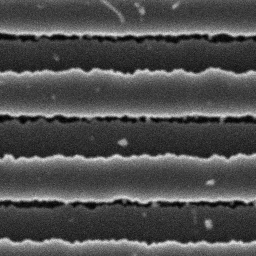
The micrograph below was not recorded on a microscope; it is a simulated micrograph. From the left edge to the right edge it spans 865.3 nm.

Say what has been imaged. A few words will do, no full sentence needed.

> lines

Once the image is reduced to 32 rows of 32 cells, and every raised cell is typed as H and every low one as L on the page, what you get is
HHHHHHHHHHHHHHHHHHHHHHHHHHHHHHHH
HHHHHHHHHHHHHHHHHHHHHHHHHHHHHHHH
HHHHHHHHHHHHHHHHHHHHHHHHHHHHHHHH
HHHHHHHHHHHHHHHHHHHHHHHHHHHHHHHH
LLLLLLLLLLLLLLLHLHLLLLLLLLLLLHLL
LLLLLLLLLLLLLLLLLLLLLLLLLLLLLLLL
LLLLLLLLLLLLLLLLLLLLLLLLLLLLLLLL
LLLLLLLLLLLLLLLLLLLLLLLLLLLLLLLL
LLLLLLLLLLLLLLLLLLLLLLLLLLLLLLLL
HHHHHHHHHHHHHHHHHHHHHHHHHHHHHHHH
HHHHHHHHHHHHHHHHHHHHHHHHHHHHHHHH
HHHHHHHHHHHHHHHHHHHHHHHHHHHHHHHH
HHHHHHHHHHHHHHHHHHHHHHHHHHHHHHHH
HHHHHHHHHHHHHHHHHHHHHHHHHHHHHHHH
LHLHLHHLHHHHHHHLHHHHHHHLLHHHHHLL
LLLLLLLLLLLLLLLLLLLLLLLLLLLLLLLL
LLLLLLLLLLLLLLLLLLLLLLLLLLLLLLLL
LLLLLLLLLLLLLLLLLLLLLLLLLLLLLLLL
LLLLLLLLLLLLLLLLLLLLLLLLLLLLLLLL
LLLLLLLHLHLLLLHLLHHLHHHLLLLLLHHH
HHHHHHHHHHHHHHHHHHHHHHHHHHHHHHHH
HHHHHHHHHHHHHHHHHHHHHHHHHHHHHHHH
HHHHHHHHHHHHHHHHHHHHHHHHHHHHHHHH
HHHHHHHHHHHHHHHHHHHHHHHHHHHHHHHH
HHHHHHHHHHHHHHHHHHHHHHHHHHHHHHHH
LLLLLLLLLLLLLLLLLLLLLLLLLLLLLLLL
LLLLLLLLLLLLLLLLLLLLLLLLLLLLLLLL
LLLLLLLLLLLLLLLLLLLLLLLLLLLLLLLL
LLLLLLLLLLLLLLLLLLLLLLLLLLLLLLLL
LLLLLLLLLLLLLLLLLLLLLLLLLLLLLLLL
HHHHHHHHHHHHHHHHHHLHHHHHHHLHHHHH
HHHHHHHHHHHHHHHHHHHHHHHHHHHHHHHH